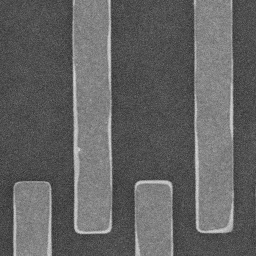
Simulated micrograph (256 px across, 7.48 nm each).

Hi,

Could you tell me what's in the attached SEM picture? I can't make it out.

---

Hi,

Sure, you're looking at groups of lines, slits or small figures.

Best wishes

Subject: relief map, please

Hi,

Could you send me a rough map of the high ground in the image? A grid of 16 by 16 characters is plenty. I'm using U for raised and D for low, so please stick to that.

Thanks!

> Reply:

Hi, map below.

DDDDDUUDDDDDUUDD
DDDDDUUDDDDDUUDD
DDDDDUUDDDDDUUUD
DDDDDUUDDDDDUUUD
DDDDDUUDDDDDUUUD
DDDDDUUDDDDDUUUD
DDDDDUUDDDDDUUDD
DDDDDUUDDDDDUUDD
DDDDDUUDDDDDUUUD
DDDDDUUDDDDDUUUD
DDDDDUUDDDDDUUUD
DUUDDUUDDUDDUUUD
DUUDDUUDUUUDUUUD
DUUDDUUDUUUDUUUD
DUUDDUDDUUUDDDDD
DUUDDDDDDUUDDDDD